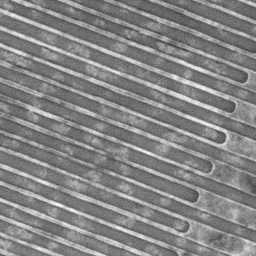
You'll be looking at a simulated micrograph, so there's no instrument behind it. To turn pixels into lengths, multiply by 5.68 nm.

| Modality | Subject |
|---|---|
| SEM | parallel lines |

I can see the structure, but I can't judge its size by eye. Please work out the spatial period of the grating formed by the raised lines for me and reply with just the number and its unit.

91.1 nanometres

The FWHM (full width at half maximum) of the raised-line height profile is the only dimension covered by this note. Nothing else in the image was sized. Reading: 19.9 nanometers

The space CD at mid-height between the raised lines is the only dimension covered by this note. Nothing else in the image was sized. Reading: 0.0749 microns